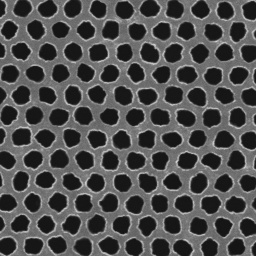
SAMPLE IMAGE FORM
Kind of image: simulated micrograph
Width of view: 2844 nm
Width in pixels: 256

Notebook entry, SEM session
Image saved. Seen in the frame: a regular array of holes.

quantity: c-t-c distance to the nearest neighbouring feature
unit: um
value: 0.268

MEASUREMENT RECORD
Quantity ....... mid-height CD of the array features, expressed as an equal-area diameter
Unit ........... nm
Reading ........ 193